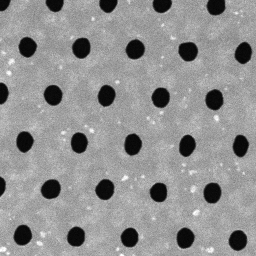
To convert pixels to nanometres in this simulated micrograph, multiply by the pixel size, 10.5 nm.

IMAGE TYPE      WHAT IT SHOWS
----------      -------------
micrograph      a regular array of holes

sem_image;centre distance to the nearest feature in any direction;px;53.3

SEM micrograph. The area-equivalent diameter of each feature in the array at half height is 0.204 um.